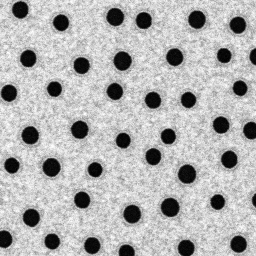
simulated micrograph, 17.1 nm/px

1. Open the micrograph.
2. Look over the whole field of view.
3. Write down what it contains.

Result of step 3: a regular array of holes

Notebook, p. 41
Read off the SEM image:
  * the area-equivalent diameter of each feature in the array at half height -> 295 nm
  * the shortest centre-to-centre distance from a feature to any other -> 608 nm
